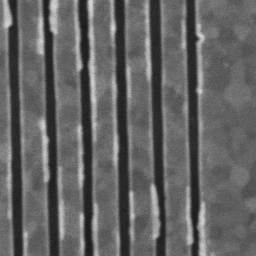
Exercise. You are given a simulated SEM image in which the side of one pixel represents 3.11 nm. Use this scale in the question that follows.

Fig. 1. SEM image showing parallel lines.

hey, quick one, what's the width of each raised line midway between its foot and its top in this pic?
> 76.8 nm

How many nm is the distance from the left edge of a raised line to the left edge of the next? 110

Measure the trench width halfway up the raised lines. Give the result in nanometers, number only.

33